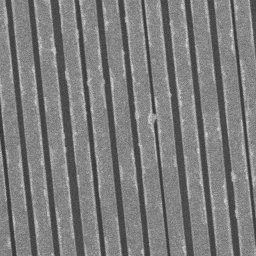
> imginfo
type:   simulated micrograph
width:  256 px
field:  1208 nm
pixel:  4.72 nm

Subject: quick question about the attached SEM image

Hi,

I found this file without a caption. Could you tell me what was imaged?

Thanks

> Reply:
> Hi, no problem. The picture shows parallel lines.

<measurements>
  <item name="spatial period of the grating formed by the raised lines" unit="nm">105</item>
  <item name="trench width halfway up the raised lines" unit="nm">31.7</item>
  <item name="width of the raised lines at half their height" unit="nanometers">73.4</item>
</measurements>